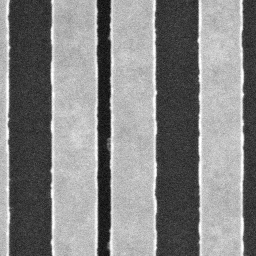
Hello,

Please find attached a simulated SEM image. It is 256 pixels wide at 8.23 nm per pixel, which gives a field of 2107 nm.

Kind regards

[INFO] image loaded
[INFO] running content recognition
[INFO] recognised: lines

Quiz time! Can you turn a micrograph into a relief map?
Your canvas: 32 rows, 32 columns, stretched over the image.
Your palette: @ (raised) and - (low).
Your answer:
@-----@@@@@@--@@@@@------@@@@@--
@------@@@@@--@@@@@------@@@@@--
@------@@@@@--@@@@@------@@@@@--
@-----@@@@@@--@@@@@------@@@@@--
@-----@@@@@@--@@@@@------@@@@@--
@------@@@@@--@@@@@------@@@@@--
@------@@@@@--@@@@@------@@@@@--
@-----@@@@@@--@@@@@------@@@@@--
@-----@@@@@@--@@@@@------@@@@@--
@-----@@@@@@--@@@@@------@@@@@--
@-----@@@@@@--@@@@@------@@@@@--
@------@@@@@--@@@@@------@@@@@--
@------@@@@@--@@@@@------@@@@@--
@------@@@@@--@@@@@------@@@@@--
@------@@@@@--@@@@@------@@@@@--
@-----@@@@@@--@@@@@------@@@@@--
@-----@@@@@@--@@@@@------@@@@@--
@------@@@@@--@@@@@------@@@@@--
@------@@@@@--@@@@@------@@@@@--
@------@@@@@--@@@@@------@@@@@--
@------@@@@@--@@@@@------@@@@@--
@-----@@@@@@--@@@@@------@@@@@--
@------@@@@@--@@@@@------@@@@@--
@-----@@@@@@--@@@@@------@@@@@--
@-----@@@@@@--@@@@@------@@@@@--
@------@@@@@--@@@@@------@@@@@--
@------@@@@@--@@@@@------@@@@@--
@------@@@@@--@@@@@------@@@@@--
@------@@@@@--@@@@@------@@@@@--
@------@@@@@--@@@@@------@@@@@--
@-----@@@@@@--@@@@@------@@@@@--
@------@@@@@--@@@@@------@@@@@--